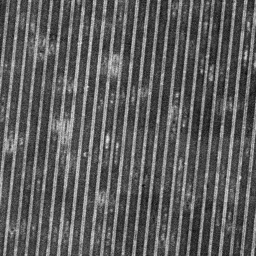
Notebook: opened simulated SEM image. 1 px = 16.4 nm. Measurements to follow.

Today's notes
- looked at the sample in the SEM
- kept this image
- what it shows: parallel lines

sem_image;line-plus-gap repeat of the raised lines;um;0.176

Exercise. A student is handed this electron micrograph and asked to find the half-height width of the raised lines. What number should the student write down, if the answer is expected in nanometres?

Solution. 32.6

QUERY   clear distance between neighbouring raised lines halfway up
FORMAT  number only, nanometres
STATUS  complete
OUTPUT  143